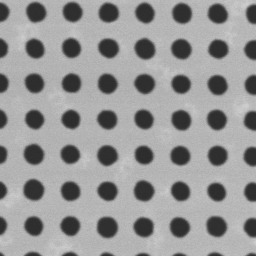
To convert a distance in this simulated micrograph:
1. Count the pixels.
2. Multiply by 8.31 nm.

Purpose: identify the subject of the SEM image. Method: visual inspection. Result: a regular array of holes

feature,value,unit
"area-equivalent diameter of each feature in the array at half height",163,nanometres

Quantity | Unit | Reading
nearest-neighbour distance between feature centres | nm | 294